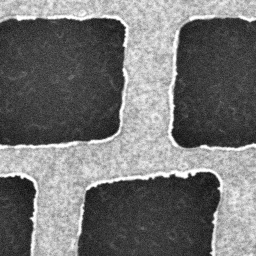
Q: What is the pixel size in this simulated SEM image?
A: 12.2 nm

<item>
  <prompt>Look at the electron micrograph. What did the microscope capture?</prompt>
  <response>holes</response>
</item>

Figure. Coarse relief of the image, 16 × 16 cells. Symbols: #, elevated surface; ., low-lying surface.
################
........####....
........###.....
........###.....
........###.....
........###.....
........###.....
........###.....
.......####.....
################
################
..####........##
..###.........##
..###........###
..###........###
..###........###